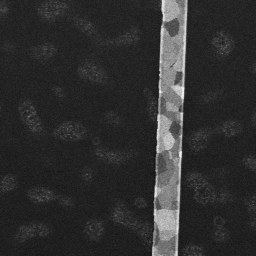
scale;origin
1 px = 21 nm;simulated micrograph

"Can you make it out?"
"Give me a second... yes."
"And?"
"one or a few lines or trenches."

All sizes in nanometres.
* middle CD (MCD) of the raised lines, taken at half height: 485